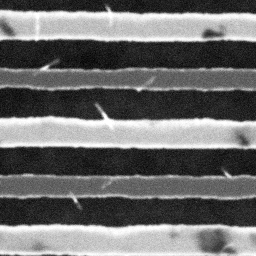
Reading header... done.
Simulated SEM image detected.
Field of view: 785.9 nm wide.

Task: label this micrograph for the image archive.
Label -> lines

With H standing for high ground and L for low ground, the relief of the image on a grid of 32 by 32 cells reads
LLLLLLLLLLLLLLLLLLLLLLLLLLLLLLLL
HLLLLLLLLLLLLLLLLLLLLLLLLLLLLLLL
HHHHHHHHHHHHHHHHHHHHHHHHHHHHHHHH
HHHHHHHHHHHHHHHHHHHHHHHHHHHHHHHH
HHHHHHHHHHHHHHHHHHHHHHHHHHHHHHHH
LLLLLLLLLLLLLLLLLLLLLLLLLLLLLLLL
LLLLLLLLLLLLLLLLLLLLLLLLLLLLLLLL
LLLLLLLLLLLLLLLLLLLLLLLLLLLLLLLL
LLLLLHLLLLLLLLLLLLLLLLLLLLLLLLLL
HHHHHHHHHHHHHHHHHHHHHHHHHHHHHHHH
HHHHHHHHHHHHHHHHHHHHHHHHHHHHHHHH
LLLLLLLLLLLLLLLLLLLLLLLLLLLLLLLL
LLLLLLLLLLLLLLLLLLLLLLLLLLLLLLLL
LLLLLLLLLLLLLLLLLLLLLLLLLLLLLLLL
LLLLLLLLLLLLLLLLLLLLLLLLLLLLLLLL
HHHHHHHHHHHHHHHHHHHHHHHHHHHHHHHH
HHHHHHHHHHHHHHHHHHHHHHHHHHHHHHHH
HHHHHHHHHHHHHHHHHHHHHHHHHHHHHHHH
LLLLLLLLLLLLLLLLLLLLLLLLLLLLLLLL
LLLLLLLLLLLLLLLLLLLLLLLLLLLLLLLL
LLLLLLLLLLLLLLLLLLLLLLLLLLLLLLLL
LLLLLLLLLLLLLLLLLLLLLLLLLLLLLLLL
HHHHHHHHHHHHHHHHHHHHHHHHHHHHHHHH
HHHHHHHHHHHHHHHHHHHHHHHHHHHHHHHH
HHHHHLHHHHHHHHLHHHHHHHHHHHHHHHHH
LLLLLLLLLLLLLLLLLLLLLLLLLLLLLLLL
LLLLLLLLLLLLLLLLLLLLLLLLLLLLLLLL
LLLLLLLLLLLLLLLLLLLLLLLLLLLLLLLL
HHHHHHHHHHHHHLLLHHHHHHHHHHHHHHLL
HHHHHHHHHHHHHHHHHHHHHHHHHHHHHHHH
HHHHHHHHHHHHHHHHHHHHHHHHHHHHHHHH
HHHHHHHHHHHHHHHHHHHHHHHHHHHHHHHH